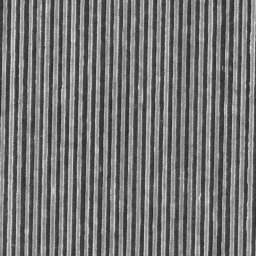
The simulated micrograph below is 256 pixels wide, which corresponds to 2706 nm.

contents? parallel lines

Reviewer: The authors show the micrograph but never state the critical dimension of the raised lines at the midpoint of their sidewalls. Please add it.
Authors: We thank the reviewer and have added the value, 42.3 nanometres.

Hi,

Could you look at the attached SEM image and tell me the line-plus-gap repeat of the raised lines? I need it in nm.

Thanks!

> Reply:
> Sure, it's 90.4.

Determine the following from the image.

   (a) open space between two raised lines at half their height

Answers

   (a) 52.9 nanometers